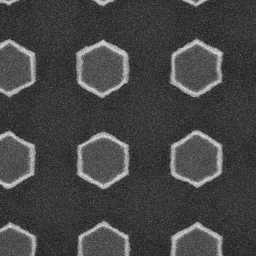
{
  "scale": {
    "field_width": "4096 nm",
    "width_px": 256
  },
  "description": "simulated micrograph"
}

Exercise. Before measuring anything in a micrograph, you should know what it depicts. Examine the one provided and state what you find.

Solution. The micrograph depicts raised bodies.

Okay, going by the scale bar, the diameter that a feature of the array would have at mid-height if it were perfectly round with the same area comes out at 806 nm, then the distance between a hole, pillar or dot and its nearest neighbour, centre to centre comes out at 1460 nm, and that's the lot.